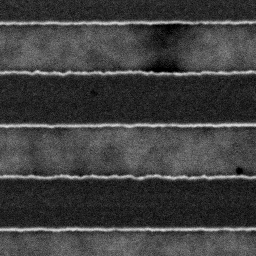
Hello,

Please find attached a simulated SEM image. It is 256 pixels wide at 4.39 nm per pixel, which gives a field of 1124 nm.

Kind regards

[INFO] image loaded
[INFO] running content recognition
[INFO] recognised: lines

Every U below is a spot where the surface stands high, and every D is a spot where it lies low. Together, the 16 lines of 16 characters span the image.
UUUUUUUUUUUUUUUU
UUUUUDUUDUDDDDDD
DDDDDDDDDDDDDDDD
DDDDDDDDDDDDDDDD
UDDDDDDDUDDDDDDU
UUUUUUUUUUUUUUUU
UUUUUUUUUUUUUUUU
UUUUUUUUUUUUUUUU
DDDDDDDDDDDDDDDD
DDDDDDDDDDDDDDDD
DDDDDDDDDDDDDDDD
UUUUUUUUUUUUUUUU
UUUUUUUUUUUUUUUU
UUUUUUUUUUUUUUUU
DDDDDDDDDDDDDDDD
DDDDDDDDDDDDDDDD